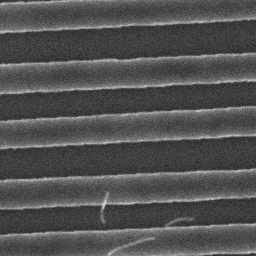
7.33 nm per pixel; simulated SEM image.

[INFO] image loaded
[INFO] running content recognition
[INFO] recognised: lines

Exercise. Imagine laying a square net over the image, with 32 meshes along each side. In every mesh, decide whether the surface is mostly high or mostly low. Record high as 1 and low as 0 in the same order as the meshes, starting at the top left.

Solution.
11111111111111111111111111111111
11111111111111111111111111111111
11111111111111111111111111111000
11111111110000000000000000000000
00000000000000000000000000000000
00000000000000000000000000000000
00000000000000000000000000000000
00000000000001101111111111111111
11111111111111111111111111111111
11111111111111111111111111111111
11111111111111111111111100000000
11111000000000000000000000000000
00000000000000000000000000000000
00000000000000000000000000001111
00000000000111111111111111111111
11111111111111111111111111111111
11111111111111111111111111111111
11111111111111111111000000000000
10000000000000000000000000000000
00000000000000000000000000000000
00000000000000000000000000000000
00000000000000000000000010111111
00001111111111111111111111111111
11111111111111111111111111111111
11111111111111111111111111111111
11111111111111000000000000000000
00000000000000000000000000000000
00000000000000000000000000000000
00000000000000000000111111111111
11111111111111111111111111111111
11111111111111111111111111111111
11111111111111111111111111111111